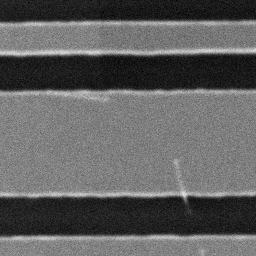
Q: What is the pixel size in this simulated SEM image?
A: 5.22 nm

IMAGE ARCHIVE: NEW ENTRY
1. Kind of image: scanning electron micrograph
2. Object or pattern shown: lines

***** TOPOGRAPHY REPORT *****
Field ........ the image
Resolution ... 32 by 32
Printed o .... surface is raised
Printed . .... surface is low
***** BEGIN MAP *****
................................
................................
................................
oooooooooooooooooooooooooooooooo
oooooooooooooooooooooooooooooooo
oooooooooooooooooooooooooooooooo
oooooooooooooooooooooooooooooooo
................................
................................
................................
................................
..oooooooooooooooooooooooooooooo
oooooooooooooooooooooooooooooooo
oooooooooooooooooooooooooooooooo
oooooooooooooooooooooooooooooooo
oooooooooooooooooooooooooooooooo
oooooooooooooooooooooooooooooooo
oooooooooooooooooooooooooooooooo
oooooooooooooooooooooooooooooooo
oooooooooooooooooooooooooooooooo
oooooooooooooooooooooooooooooooo
oooooooooooooooooooooooooooooooo
oooooooooooooooooooooooooooooooo
oooooooooooooooooooooooooooooooo
...oo.......o...................
................................
................................
................................
................................
................................
oooooooooooooooooooooooooooooooo
oooooooooooooooooooooooooooooooo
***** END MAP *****